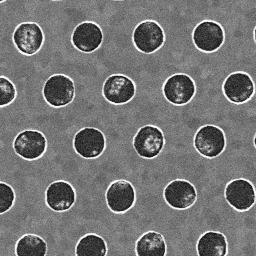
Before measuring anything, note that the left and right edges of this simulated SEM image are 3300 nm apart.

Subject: a regular array of holes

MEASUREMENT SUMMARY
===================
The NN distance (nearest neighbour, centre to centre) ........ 768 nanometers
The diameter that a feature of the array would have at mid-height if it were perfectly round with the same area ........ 393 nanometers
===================